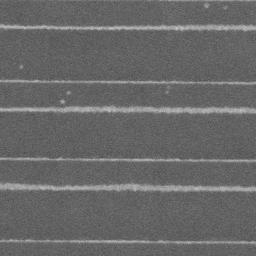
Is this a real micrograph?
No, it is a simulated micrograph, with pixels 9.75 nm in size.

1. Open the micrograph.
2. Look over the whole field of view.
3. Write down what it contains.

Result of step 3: lines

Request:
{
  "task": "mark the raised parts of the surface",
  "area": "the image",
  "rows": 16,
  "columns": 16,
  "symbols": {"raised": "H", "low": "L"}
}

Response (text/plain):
HHHHHHHHHHHHHHHH
HHHHHHHHHHHHHHHH
LLLLLLLLLLLLLLLL
LLLLLLLLLLLLLLLL
LLLLLLLLLLLLLLLL
HHHHHHHHHHHHHHHH
HHHHHHHHHHHHHHHH
LLLLLLLLLLLLLLLL
LLLLLLLLLLLLLLLL
LLLLLLLLLLLLLLLL
HHHHHHHHHHHHHHHH
HHHHHHHHHHHHHHHH
LLLLLLLLLLLLLLLL
LLLLLLLLLLLLLLLL
LLLLLLLLLLLLLLLL
HHHHHHHHHHHHHHHH